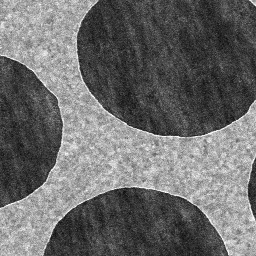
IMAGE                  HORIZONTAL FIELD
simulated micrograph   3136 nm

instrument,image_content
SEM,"holes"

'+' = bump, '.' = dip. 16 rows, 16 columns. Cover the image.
++++++..........
+++++...........
+++++...........
+++++...........
..+++...........
...++...........
....++..........
....++++.......+
....++++++..++++
....++++++++++++
...+++++++++++++
...+++++++++++++
.++++.......++++
++++.........+++
+++...........++
+++...........++